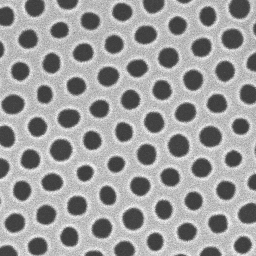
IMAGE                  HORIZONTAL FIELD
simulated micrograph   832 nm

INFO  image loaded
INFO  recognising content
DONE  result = a regular array of holes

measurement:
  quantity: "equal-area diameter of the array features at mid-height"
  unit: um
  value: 0.0658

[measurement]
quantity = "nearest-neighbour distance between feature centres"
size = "32 px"